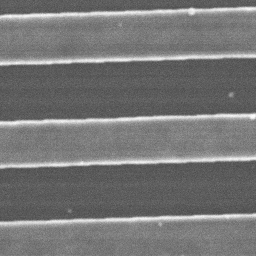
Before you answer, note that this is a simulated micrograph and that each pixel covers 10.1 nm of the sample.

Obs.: lines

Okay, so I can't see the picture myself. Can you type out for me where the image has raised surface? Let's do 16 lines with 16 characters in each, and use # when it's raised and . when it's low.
...............#
################
################
################
................
................
................
......##########
################
################
................
................
................
............####
################
################